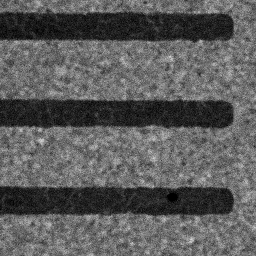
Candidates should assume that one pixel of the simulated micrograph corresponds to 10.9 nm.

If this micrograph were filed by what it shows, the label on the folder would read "one or a few lines or trenches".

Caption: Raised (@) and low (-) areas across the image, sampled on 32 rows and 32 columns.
@@@@@@@@@@@@@@@@@@@@@@@@@@@@@@@@
-@@@@@@@@@@------@@@@@@@@@@@@@@@
-------------------@---------@@@
----@@-----------------------@@@
-----------------------------@@@
@@@@@@@@@@@@@@@@@@@@@@@@@@@@@@@@
@@@@@@@@@@@@@@@@@@@@@@@@@@@@@@@@
@@@@@@@@@@@@@@@@@@@@@@@@@@@@@@@@
@@@@@@@@@@@@@@@@@@@@@@@@@@@@@@@@
@@@@@@@@@@@@@@@@@@@@@@@@@@@@@@@@
@@@@@@@@@@@@@@@@@@@@@@@@@@@@@@@@
@@@@@@@@@@@@@@@@@@@@@@@@@@@@@@@@
---------------@----@@-@@@--@@@@
-----------------------------@@@
-----------------------------@@@
-----------------------------@@@
@@@@@@@@@@@@@@@@@@@@@@@@@@@@@@@@
@@@@@@@@@@@@@@@@@@@@@@@@@@@@@@@@
@@@@@@@@@@@@@@@@@@@@@@@@@@@@@@@@
@@@@@@@@@@@@@@@@@@@@@@@@@@@@@@@@
@@@@@@@@@@@@@@@@@@@@@@@@@@@@@@@@
@@@@@@@@@@@@@@@@@@@@@@@@@@@@@@@@
@@@@@@@@@@@@@@@@@@@@@@@@@@@@@@@@
---------------------@------@@@@
-----------------------------@@@
-----------------------------@@@
-----------------------------@@@
@@@@@@@@@@@@@@@@@@@@@@@@@@@@@@@@
@@@@@@@@@@@@@@@@@@@@@@@@@@@@@@@@
@@@@@@@@@@@@@@@@@@@@@@@@@@@@@@@@
@@@@@@@@@@@@@@@@@@@@@@@@@@@@@@@@
@@@@@@@@@@@@@@@@@@@@@@@@@@@@@@@@